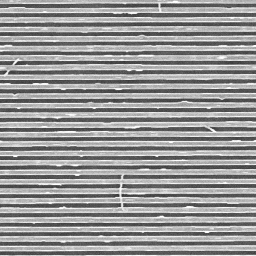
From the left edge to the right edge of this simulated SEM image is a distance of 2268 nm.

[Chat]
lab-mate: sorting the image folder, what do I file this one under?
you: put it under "parallel lines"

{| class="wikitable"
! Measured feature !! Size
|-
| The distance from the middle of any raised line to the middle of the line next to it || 84.4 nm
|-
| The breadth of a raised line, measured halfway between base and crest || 45.4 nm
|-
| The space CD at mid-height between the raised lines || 4.26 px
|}